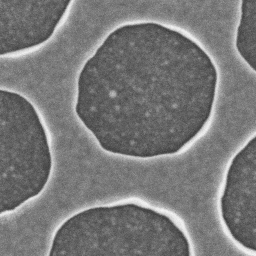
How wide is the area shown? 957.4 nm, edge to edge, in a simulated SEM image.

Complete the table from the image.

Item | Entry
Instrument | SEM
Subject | holes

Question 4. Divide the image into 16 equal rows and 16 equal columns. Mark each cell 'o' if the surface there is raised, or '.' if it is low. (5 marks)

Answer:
....ooooooooooo.
....oooo..ooooo.
...oooo.....ooo.
oooooo.......oo.
ooooo.........oo
ooooo.........oo
..ooo........ooo
...oo........ooo
...ooo......oooo
...oooo....oooo.
...ooooooooooo..
...ooooooooooo..
..oooooooooooo..
ooooo......ooo..
oooo.......ooo..
ooo.........ooo.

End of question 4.